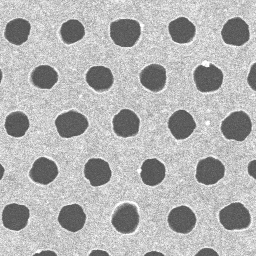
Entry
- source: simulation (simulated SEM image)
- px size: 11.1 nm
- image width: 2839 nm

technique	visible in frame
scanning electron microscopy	a regular array of holes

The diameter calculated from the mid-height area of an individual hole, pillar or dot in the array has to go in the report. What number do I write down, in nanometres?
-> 310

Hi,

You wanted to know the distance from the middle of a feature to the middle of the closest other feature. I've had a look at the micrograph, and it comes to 589 nanometers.